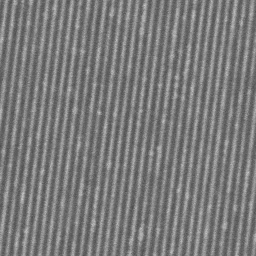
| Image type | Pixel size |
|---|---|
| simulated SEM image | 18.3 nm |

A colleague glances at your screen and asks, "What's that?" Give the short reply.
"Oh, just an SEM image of parallel lines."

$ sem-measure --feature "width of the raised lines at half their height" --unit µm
0.0363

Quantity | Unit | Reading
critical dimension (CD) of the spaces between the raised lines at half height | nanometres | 105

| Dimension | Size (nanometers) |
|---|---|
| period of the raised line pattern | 149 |